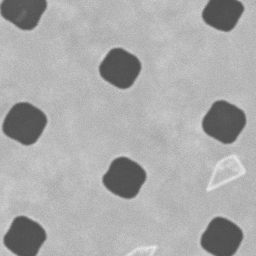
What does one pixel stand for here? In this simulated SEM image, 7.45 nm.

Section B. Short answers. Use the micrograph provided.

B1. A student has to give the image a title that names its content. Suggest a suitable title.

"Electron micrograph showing holes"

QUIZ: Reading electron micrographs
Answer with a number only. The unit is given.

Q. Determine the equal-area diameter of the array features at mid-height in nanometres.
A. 310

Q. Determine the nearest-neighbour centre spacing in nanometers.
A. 819